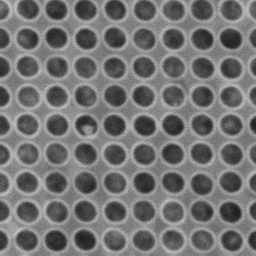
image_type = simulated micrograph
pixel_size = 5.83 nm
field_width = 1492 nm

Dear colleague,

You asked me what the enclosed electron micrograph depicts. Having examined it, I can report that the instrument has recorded a regular array of holes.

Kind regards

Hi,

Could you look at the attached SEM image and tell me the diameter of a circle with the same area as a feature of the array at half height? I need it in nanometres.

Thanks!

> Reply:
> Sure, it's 132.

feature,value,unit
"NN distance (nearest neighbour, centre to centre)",0.165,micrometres